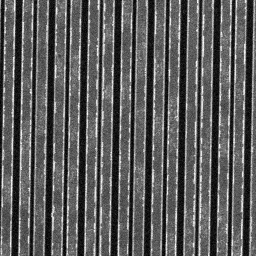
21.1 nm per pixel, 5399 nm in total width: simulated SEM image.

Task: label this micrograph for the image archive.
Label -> parallel lines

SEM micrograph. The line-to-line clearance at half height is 153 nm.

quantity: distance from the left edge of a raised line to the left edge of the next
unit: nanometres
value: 348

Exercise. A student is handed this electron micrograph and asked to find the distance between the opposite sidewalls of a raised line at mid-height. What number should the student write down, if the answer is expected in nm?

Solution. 221